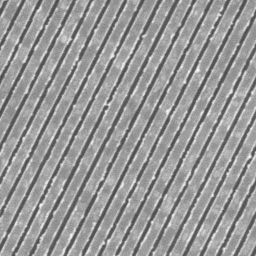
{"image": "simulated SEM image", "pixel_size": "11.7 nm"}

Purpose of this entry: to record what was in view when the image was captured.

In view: parallel lines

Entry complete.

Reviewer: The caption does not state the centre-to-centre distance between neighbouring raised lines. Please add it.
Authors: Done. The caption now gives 15.2 px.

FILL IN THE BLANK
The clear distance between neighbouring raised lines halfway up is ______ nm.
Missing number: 49.6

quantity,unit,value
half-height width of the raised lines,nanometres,128